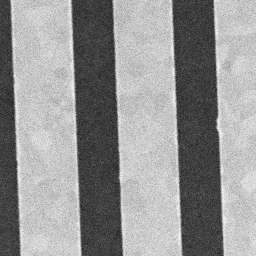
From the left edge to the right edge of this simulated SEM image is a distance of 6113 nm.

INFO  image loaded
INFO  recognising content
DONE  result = one or a few lines or trenches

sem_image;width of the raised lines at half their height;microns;1.39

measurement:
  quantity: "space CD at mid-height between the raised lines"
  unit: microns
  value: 1.03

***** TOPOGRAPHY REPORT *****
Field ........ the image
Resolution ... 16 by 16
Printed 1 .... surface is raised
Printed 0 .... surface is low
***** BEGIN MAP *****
0111000111100111
0111000111100011
0111000111100011
0111100111100011
0111100111100011
0111100111100011
0111100111100011
0111100111100011
0111100111100011
0111100111100011
0111100011100011
0111100011100011
0111100011100011
0111100011100011
0111100011100011
0111100011100011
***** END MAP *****